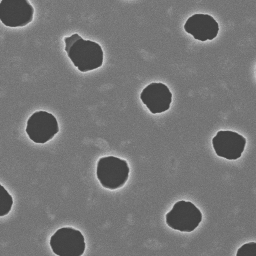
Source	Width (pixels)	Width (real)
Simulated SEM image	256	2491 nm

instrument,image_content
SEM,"holes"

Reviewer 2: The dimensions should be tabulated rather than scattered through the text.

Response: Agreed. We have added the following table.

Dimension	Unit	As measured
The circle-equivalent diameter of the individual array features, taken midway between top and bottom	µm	0.305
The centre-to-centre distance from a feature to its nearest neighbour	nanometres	815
